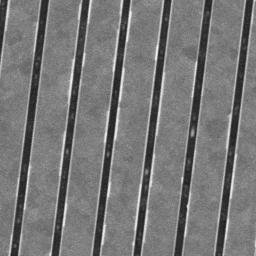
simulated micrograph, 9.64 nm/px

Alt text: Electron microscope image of parallel lines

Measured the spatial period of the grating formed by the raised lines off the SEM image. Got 392 nm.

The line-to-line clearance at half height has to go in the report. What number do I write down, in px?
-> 8.18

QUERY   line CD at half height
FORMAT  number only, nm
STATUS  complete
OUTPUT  315